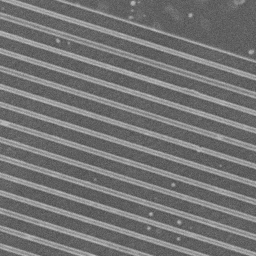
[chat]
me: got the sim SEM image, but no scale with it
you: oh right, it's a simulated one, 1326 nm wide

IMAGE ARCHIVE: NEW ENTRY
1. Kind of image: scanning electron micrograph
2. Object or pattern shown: parallel lines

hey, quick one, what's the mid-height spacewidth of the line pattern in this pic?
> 63.7 nm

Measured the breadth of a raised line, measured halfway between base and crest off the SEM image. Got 23.5 nm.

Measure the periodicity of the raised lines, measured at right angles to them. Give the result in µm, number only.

0.0877